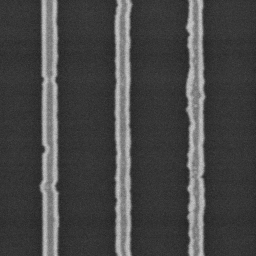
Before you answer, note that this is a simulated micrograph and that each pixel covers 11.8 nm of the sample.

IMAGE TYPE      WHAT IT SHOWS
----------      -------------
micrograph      one or a few lines or trenches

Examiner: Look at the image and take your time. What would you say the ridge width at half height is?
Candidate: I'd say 120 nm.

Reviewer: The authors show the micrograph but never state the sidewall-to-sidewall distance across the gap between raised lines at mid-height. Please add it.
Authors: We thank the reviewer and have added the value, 0.745 um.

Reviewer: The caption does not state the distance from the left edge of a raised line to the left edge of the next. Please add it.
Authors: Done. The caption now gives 73 pixels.